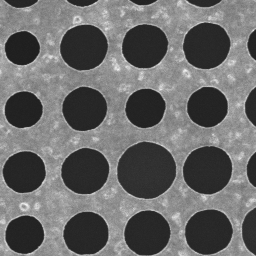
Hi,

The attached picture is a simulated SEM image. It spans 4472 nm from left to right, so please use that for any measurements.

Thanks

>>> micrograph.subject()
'a regular array of holes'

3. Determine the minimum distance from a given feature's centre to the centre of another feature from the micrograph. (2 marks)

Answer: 1070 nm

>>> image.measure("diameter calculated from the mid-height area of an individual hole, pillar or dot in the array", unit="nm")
776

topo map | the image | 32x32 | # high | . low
#...#####...#####..#####...#####
################################
################################
#########...#####...####....####
#...####.....###.....##......##.
#....###.....##......##......##.
#....###.....##......##......##.
#...####.....###....###.....####
#########...#############..#####
################################
################################
##..#####...#####...####....###.
#....###.....###.....###....###.
#....###.....###.....##......##.
#....###.....###....####....###.
#...#####....####...#####..#####
################################
################################
################.....####..#####
#....####....##.......##.....##.
#.....##......#.......#......##.
......##......#.......#......##.
#....###.....##.......#......##.
#....####....##......###....####
#################...############
################################
##################.######...###.
##...####....###.....###.....#..
#....###.....###.....##......#..
#....###......##.....##......#..
#....###.....###.....###.....##.
##..#####...#####...#####..####.